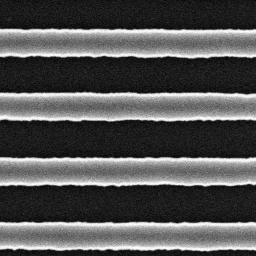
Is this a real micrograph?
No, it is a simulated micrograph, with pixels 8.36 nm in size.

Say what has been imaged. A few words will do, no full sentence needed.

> lines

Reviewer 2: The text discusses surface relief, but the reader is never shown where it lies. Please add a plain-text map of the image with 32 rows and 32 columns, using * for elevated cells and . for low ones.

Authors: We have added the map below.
................................
................................
................................
................................
********************************
********************************
********************************
................................
................................
................................
................................
................................
********************************
********************************
********************************
................................
................................
................................
................................
................................
********************************
********************************
********************************
................................
................................
................................
................................
................................
********************************
********************************
********************************
................................